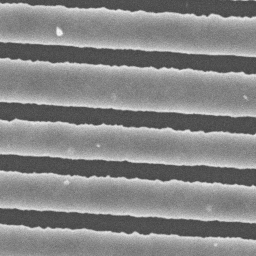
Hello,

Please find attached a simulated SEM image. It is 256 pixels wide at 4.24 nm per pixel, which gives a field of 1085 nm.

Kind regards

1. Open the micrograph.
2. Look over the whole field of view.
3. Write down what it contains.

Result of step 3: lines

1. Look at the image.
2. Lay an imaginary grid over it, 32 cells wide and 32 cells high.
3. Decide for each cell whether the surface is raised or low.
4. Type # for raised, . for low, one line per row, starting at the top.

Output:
#.#.............................
##################..............
################################
################################
################################
.....###########################
......................##########
##..............................
###################.............
################################
################################
################################
################################
...........#####################
............................####
#########.......................
##########################.#....
################################
################################
......##########################
....................############
##..............................
####################.#..........
################################
################################
################################
........########################
.........................#######
######..........................
######################..........
################################
################################